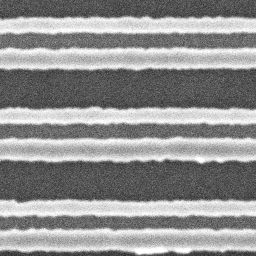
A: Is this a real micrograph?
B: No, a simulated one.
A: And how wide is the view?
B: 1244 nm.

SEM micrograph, lines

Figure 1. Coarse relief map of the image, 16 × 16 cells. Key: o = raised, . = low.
................
oooooooooooooooo
oooooooooooooooo
oooooooooooooooo
................
................
................
oooooooooooooooo
oooooooooooooooo
oooooooooooooooo
................
................
................
oooooooooooooooo
oooooooooooooooo
oooooooooooooooo